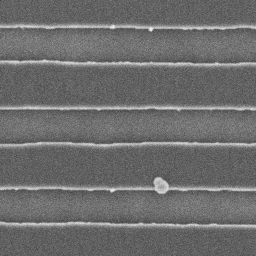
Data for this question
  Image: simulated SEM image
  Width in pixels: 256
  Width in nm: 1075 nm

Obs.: lines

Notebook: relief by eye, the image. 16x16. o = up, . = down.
oooooooooooooooo
oooooooooooooooo
................
................
oooooooooooooooo
oooooooooooooooo
oooooooooooooooo
................
................
oooooooooooooooo
oooooooooooooooo
oooooooooooooooo
................
................
oooooooooooooooo
oooooooooooooooo